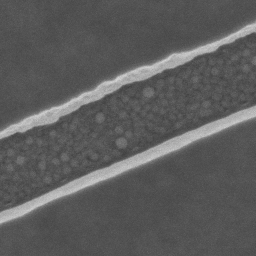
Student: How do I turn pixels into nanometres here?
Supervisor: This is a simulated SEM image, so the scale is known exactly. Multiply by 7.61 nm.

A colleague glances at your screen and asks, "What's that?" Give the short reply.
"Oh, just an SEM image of one or a few lines or trenches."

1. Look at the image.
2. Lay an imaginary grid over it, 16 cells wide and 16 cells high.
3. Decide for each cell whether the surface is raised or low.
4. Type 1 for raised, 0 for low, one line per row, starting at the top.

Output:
1111111111111111
1111111111111111
1111111111111100
1111111111110000
1111111110000000
1111111000000000
1111100000000000
1100000000000011
0000000000001111
0000000000111111
0000000111111111
0000011111111111
0001111111111111
1111111111111111
1111111111111111
1111111111111111